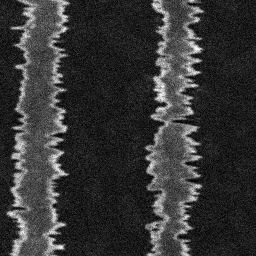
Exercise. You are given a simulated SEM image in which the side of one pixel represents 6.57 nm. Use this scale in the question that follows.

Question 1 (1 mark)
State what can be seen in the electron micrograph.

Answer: one or a few lines or trenches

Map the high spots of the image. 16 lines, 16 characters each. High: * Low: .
..**......**....
..**......**....
.**.......**....
..**......**....
.***......**....
.***......**....
.***......**....
.***......**....
.***......**....
.***.....***....
.***.....***....
.**.......**....
.**.......**....
.**.......**....
.**......**.....
.**......***....